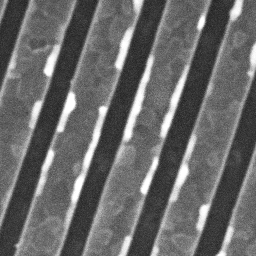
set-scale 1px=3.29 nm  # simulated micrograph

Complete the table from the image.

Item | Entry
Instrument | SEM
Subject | one or a few lines or trenches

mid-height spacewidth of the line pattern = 76.9 nm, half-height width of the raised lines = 135 nm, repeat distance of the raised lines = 212 nm